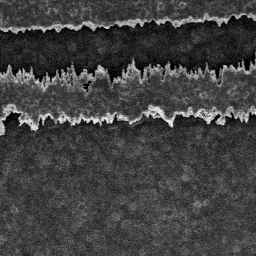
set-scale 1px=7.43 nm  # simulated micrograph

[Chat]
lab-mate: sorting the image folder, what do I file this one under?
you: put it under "one or a few lines or trenches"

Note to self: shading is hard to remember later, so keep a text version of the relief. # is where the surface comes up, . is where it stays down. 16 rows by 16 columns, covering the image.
################
#######.........
................
................
........#####.##
################
################
..#.###.#.......
................
................
................
................
................
................
................
................